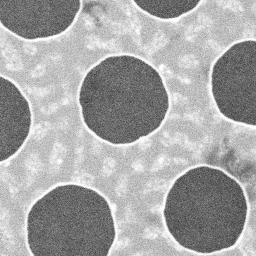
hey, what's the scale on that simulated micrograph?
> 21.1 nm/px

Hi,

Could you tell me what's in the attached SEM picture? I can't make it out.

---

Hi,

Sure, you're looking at holes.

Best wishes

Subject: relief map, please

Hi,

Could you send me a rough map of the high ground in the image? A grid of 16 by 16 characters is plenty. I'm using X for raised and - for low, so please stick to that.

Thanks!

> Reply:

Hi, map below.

-----XXXX---XXXX
----XXXXXXXXXXXX
XXXXXXXXXXXXXXXX
XXXXXXX-XXXXXX--
XXXXXX----XXX---
-XXXX-----XXX---
--XXX------XXX--
--XXX-----XXXX--
--XXXX---XXXXXXX
-XXXXXXXXXXXXXXX
XXXXXXXXXXXX-XXX
XXXXXXXXXXX----X
XX-----XXX-----X
XX-----XXX-----X
XX-----XXXX----X
XX-----XXXXX--XX